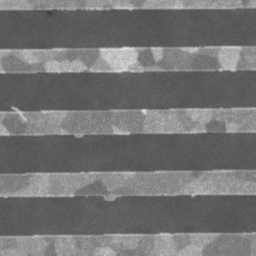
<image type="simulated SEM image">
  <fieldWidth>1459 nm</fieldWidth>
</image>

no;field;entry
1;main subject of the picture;lines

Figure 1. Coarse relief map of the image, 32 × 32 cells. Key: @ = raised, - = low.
@@@@@@@@@@@@@@@@@@@@@@@@@@@@@@@@
--------------------------------
--------------------------------
--------------------------------
--------------------------------
--------------------------------
@@@@@@@@@@@@@@@@@@@@@@@@@@@@@@@@
@@@@@@@@@@@@@@@@@@@@@@@@@@@@@@@@
@@@@@@@@@@@@@@@@@@@@@@@@@@@@@@@@
--------------------------------
--------------------------------
--------------------------------
--------------------------------
--------------------------------
@@@@@@@@@@@@@@@@@@@@@@@@@@@@@@@@
@@@@@@@@@@@@@@@@@@@@@@@@@@@@@@@@
@@@@@@@@@@@@@@@@@@@@@@@@@-------
--------------------------------
--------------------------------
--------------------------------
--------------------------------
-------------------@@@@@@@@@@@@@
@@@@@@@@@@@@@@@@@@@@@@@@@@@@@@@@
@@@@@@@@@@@@@@@@@@@@@@@@@@@@@@@@
@@@@@@@@@@@--@@-----------------
--------------------------------
--------------------------------
--------------------------------
--------------------------------
----@@@@@@@@@@@@@@@@@@@@@@@@@@@@
@@@@@@@@@@@@@@@@@@@@@@@@@@@@@@@@
@@@@@@@@@@@@@@@@@@@@@@@@@@@@@@@@